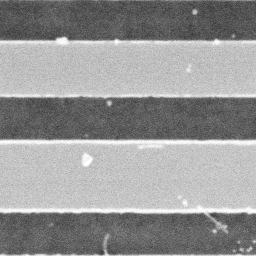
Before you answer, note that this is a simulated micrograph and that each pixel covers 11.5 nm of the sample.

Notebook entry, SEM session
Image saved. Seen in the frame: lines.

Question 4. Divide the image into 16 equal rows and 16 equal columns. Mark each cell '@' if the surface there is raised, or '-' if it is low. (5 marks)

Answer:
----------------
----------------
---@------------
@@@@@@@@@@@@@@@@
@@@@@@@@@@@@@@@@
@@@@@@@@@@@@@@@@
----------------
----------------
----------------
@@@@@@@@@@@@@@@@
@@@@@@@@@@@@@@@@
@@@@@@@@@@@@@@@@
@@@@@@@@@@@@@@@@
----------------
----------------
----------------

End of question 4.